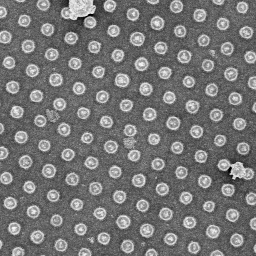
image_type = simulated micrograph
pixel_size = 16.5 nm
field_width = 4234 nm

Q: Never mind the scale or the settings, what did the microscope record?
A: a regular array of raised bodies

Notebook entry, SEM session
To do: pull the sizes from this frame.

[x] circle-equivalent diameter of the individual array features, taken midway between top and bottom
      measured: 194 nm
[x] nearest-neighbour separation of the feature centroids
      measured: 408 nanometers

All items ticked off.